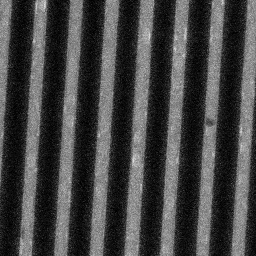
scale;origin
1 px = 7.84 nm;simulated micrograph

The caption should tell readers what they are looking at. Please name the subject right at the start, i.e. parallel lines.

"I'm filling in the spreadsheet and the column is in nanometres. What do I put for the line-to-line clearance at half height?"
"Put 86.1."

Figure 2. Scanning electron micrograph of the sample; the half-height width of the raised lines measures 0.191 micrometres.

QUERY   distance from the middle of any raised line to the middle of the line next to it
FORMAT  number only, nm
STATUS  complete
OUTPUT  277